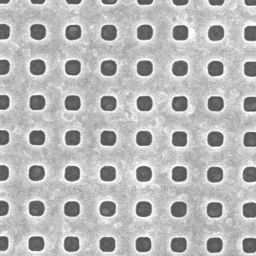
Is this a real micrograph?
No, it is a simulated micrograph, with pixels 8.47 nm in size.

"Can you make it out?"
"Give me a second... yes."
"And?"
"a regular array of holes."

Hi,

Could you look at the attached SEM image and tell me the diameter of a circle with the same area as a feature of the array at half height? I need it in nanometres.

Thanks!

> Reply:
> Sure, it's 147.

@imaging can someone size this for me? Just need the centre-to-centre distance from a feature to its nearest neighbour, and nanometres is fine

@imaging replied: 298